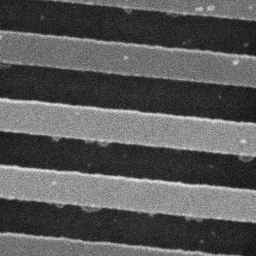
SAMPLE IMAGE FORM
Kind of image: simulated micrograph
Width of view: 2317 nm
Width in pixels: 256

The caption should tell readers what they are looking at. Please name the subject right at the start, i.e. lines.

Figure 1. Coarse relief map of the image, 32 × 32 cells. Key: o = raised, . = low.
..........oooooooooooooooooooooo
......................oooooooooo
................................
................................
ooooooo.........................
ooooooooooooooooo...............
ooooooooooooooooooooooooooo.....
oooooooooooooooooooooooooooooooo
.......ooooooooooooooooooooooooo
..................oooooooooooooo
............................oooo
................................
oo..............................
oooooooooooo....................
oooooooooooooooooooooo..........
oooooooooooooooooooooooooooooooo
.ooooooooooooooooooooooooooooooo
............oooooooooooooooooooo
......................oooooooooo
................................
................................
oooooooooo......................
ooooooooooooooooooo.............
ooooooooooooooooooooooooooooo...
oooooooooooooooooooooooooooooooo
.........ooooooooooooooooooooooo
..................oooooooooooooo
.............................ooo
................................
oooo............................
ooooooooooooooo.................
ooooooooooooooooooooooooo.......